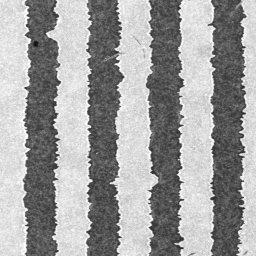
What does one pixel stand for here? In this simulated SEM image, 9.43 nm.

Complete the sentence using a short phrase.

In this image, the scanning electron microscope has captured one or a few lines or trenches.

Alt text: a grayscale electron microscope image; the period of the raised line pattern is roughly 591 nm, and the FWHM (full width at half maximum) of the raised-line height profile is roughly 285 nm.